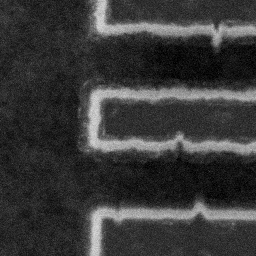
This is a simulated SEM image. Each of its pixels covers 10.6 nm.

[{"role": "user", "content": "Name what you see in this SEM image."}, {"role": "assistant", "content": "one or a few lines or trenches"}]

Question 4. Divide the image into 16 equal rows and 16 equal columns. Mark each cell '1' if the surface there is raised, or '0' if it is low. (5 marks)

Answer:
0000001111111111
0000001111111111
0000000000000000
0000000000000000
0000000000000000
0000000000000000
0000001111111111
0000001111111111
0000001111111111
0000000000000000
0000000000000000
0000000000000000
0000000000000000
0000001111111111
0000001111111111
0000001111111111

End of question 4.